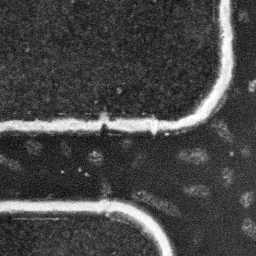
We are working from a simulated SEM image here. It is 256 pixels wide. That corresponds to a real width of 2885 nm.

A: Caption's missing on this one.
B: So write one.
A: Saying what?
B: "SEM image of one or a few lines or trenches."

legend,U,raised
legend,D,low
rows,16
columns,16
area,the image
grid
UUUUUUUUUUUUUUDD
UUUUUUUUUUUUUUDD
UUUUUUUUUUUUUUDD
UUUUUUUUUUUUUUDD
UUUUUUUUUUUUUUDD
UUUUUUUUUUUUUUDD
UUUUUUUUUUUUUDDD
UUUUUUUUUUUUDDDD
DDDDDDDDDDDDDDDD
DDDDDDDDDDDDDDDD
DDDDDDDDDDDDDDDD
DDDDDDDDDDDDDDDD
DDDDDDDDDDDDDDDD
UUUUUUUUUDDDDDDD
UUUUUUUUUUDDDDDD
UUUUUUUUUUDDDDDD